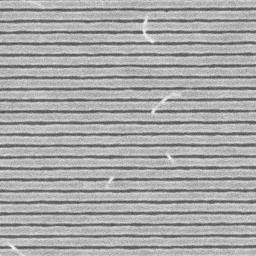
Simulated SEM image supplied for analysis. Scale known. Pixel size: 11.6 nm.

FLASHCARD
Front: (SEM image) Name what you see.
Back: parallel lines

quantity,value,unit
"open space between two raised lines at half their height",40.6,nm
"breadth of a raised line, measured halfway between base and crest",0.0912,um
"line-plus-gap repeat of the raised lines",131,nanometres